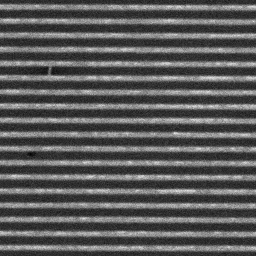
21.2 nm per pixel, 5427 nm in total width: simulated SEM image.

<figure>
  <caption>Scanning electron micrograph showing parallel lines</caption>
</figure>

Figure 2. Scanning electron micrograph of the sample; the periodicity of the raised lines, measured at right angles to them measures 300 nm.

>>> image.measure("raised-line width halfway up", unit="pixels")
4.37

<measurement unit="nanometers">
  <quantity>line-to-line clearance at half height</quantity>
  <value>204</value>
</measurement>